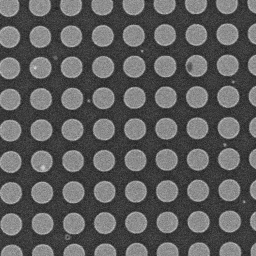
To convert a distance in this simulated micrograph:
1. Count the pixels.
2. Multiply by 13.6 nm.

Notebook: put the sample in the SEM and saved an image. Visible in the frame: an array of small figures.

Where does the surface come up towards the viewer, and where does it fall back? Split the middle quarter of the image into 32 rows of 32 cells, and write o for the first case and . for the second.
oooo...ooooo...ooooo...ooooo...o
oooo...ooooo...ooooo...ooooo...o
oooo....oooo....ooo....oooo....o
................................
................................
................................
.oo.....ooo.....ooo.....ooo....o
oooo...ooooo...ooooo...ooooo...o
ooooo..ooooo...ooooo...ooooo...o
oooo...ooooo...ooooo...ooooo...o
oooo....oooo....ooo.....ooo.....
................................
................................
................................
oooo....oooo....oooo....oooo...o
ooooo..ooooo...ooooo...ooooo...o
ooooo..ooooo...ooooo...ooooo...o
oooo....oooo...ooooo...ooooo...o
oooo....oooo....ooo......oo.....
................................
................................
.........................o......
oooo....oooo....oooo...ooooo...o
ooooo...ooooo..ooooo...ooooo...o
ooooo...ooooo..ooooo...ooooo...o
ooooo...oooo....oooo....oooo...o
.oo......oo......oo.............
................................
................................
..o......oo......oo......oo.....
oooo....oooo....oooo...ooooo...o
ooooo...ooooo..ooooo...ooooo...o